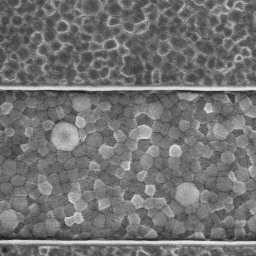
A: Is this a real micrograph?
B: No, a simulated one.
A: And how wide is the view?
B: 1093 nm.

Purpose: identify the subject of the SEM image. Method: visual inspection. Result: one or a few lines or trenches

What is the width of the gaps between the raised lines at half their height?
653 nm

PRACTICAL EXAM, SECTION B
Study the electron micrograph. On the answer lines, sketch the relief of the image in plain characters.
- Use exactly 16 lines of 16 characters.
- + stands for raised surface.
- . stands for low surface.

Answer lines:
++++++++++++++++
++++++++++++++++
++++++++++++++++
++++++++++++++++
++++++++++++++++
..++++++++++++++
................
................
................
................
................
................
................
................
................
++++++++++++++++